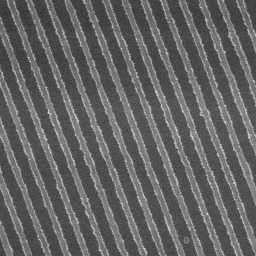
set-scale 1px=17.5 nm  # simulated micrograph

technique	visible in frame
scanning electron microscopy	parallel lines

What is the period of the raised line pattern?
314 nm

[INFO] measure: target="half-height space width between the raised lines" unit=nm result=86.1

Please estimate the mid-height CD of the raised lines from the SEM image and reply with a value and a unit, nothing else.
230 nanometres